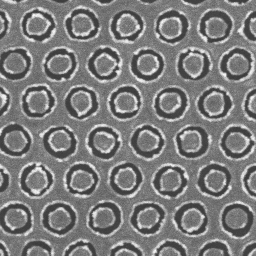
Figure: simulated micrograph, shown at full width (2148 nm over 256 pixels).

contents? a regular array of ring-shaped grooves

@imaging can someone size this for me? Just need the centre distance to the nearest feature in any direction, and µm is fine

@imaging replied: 0.356